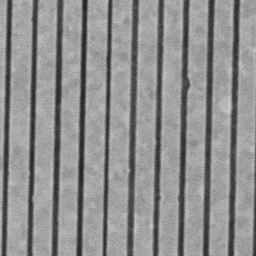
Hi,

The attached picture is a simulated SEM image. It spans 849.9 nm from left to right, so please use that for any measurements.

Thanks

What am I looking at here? parallel lines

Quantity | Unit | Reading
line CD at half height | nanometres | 63.1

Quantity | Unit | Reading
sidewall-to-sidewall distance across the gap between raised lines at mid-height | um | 0.0199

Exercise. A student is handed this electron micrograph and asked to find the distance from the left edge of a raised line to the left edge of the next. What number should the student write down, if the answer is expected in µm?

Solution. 0.0836